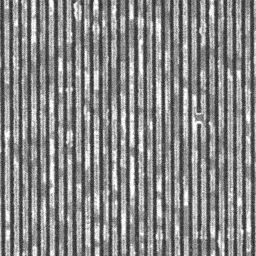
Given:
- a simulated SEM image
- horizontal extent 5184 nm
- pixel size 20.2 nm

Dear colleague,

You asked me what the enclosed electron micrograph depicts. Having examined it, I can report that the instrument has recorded parallel lines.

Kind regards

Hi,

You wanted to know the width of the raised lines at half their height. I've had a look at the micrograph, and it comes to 91.1 nanometers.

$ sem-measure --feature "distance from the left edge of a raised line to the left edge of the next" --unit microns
0.181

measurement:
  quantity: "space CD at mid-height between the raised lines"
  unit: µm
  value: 0.0911